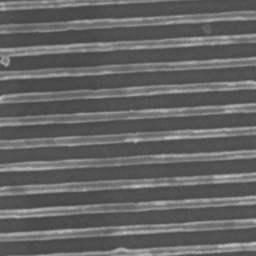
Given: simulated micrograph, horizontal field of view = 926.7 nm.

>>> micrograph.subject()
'parallel lines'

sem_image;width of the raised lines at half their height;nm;27.6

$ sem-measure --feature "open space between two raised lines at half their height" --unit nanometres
55.1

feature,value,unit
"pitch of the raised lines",83.6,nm